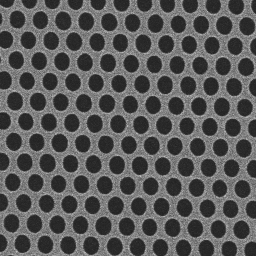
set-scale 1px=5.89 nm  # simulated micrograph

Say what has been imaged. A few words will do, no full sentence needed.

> a regular array of holes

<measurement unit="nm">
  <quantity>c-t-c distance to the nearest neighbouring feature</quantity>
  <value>135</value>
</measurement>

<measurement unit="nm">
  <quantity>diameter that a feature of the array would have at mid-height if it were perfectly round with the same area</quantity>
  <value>100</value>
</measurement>